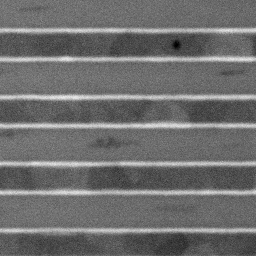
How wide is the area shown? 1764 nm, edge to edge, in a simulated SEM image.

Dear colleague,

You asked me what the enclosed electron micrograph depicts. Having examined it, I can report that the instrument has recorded wiring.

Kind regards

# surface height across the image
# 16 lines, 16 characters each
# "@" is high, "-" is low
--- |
----------------
----------------
@@@@@@@@@@@@@@@@
@@@@@@@@@@@@@@@@
----------------
----------------
@@@@@@@@@@@@@@@@
@@@@@@@@@@@@@@@@
----------------
----------------
@@@@@@@@@@@@@@@@
@@@@@@@@@@@@@@@@
----------------
----------------
@@@@@@@@@@@@@@@@
@@@@@@@@@@@@@@@@